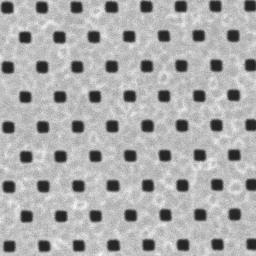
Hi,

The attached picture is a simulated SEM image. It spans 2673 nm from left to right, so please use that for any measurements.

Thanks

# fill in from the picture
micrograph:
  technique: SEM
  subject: a regular array of holes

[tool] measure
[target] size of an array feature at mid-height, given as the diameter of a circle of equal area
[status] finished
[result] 0.14 um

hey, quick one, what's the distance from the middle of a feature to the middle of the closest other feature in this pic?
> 356 nanometers